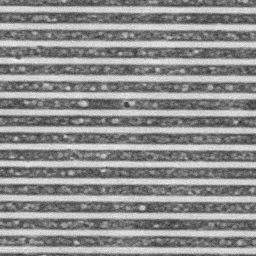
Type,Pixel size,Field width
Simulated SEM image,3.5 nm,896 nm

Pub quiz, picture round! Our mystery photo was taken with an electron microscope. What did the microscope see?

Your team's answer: parallel lines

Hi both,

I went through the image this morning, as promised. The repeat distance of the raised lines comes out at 60.2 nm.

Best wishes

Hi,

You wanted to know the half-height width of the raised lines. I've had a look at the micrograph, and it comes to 5 pixels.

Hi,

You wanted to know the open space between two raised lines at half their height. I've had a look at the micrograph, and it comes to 0.0442 um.